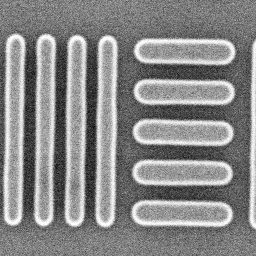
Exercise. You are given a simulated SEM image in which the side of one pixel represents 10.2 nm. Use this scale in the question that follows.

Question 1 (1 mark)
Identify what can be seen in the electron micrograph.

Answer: groups of lines, slits or small figures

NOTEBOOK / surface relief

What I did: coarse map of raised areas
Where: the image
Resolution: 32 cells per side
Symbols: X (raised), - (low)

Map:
--------------------------------
--------------------------------
--------------------------------
--------------------------------
--------------------------------
-XX--XX--XX--X---XXXXXXXXXXXX---
-XX--XX--XX-XX---XXXXXXXXXXXX---
-XX--XX--XX-XX----XXXXXXXXXXX---
-XX--XX--XX-XX------------------
-XX--XX--XX-XX------------------
-XX--XX--XX-XX---XXXXXXXXXXXX---
-XX--XX--XX-XX---XXXXXXXXXXXX---
-XX--XX--XX-XX---XXXXXXXXXXXX---
-XX--XX-XXX-XX------------------
-XX--XX-XXX-XX------------------
-XX--XX-XXX-XX---XXXXXXXXXXX----
-XX--XX-XXX-XX---XXXXXXXXXXXX---
-XX--XX-XXX-XX---XXXXXXXXXXXX---
-XX--XX-XX--XX-----------------X
-XX--XX-XX--XX-----------------X
-XX--X---X--XX---XXXXXXXXXXX---X
-XX--X--XX--XX---XXXXXXXXXXXX--X
-XX--X--XX--XX---XXXXXXXXXXXX--X
-XX--X--XX--XX-----------------X
-XX--X--XX--XX-----------------X
-XX--XX-XX--XX---XXXXXXXXXXX---X
-XX--XX-XX--XX---XXXXXXXXXXXX--X
-X---X--XX--XX---XXXXXXXXXXXX--X
--------------------------------
--------------------------------
--------------------------------
--------------------------------